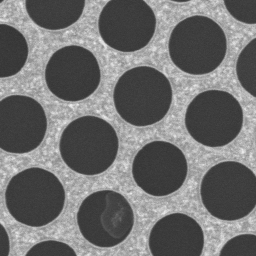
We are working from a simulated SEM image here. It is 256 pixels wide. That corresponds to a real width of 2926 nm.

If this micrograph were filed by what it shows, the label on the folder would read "a regular array of holes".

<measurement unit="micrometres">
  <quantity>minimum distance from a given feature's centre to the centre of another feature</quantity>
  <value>0.841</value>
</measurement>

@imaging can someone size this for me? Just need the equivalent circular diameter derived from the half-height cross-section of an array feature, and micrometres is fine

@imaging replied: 0.67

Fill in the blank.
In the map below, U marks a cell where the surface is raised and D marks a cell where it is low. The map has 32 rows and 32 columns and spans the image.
UUUDDDDDDDDUUDDDDDUUUUUUUUUUDDDD
UUUDDDDDDDUUUDDDDDDUUUUUUUUUUDDD
UUUUDDDDDDUUDDDDDDDUUUUDDDDUUUDD
DDUUUDDDUUUUDDDDDDDUUUDDDDDDUUUU
DDDUUUUUUUUUUDDDDDDUUDDDDDDDUUUU
DDDUUUUUUUUUUDDDDDUUUDDDDDDDUUUD
DDDDUUUDDDDUUUUDDUUUUDDDDDDDUUDD
DDDUUUDDDDDDUUUUUUUUUDDDDDDDUUDD
DDDUUUDDDDDDUUUUUDDUUUDDDDDUUDDD
DUUUUUDDDDDDDUUDDDDDDUUUUUUUUUDD
UUUUUUDDDDDDUUUDDDDDDUUUUUUUUUDD
UUUUUUDDDDDDUUDDDDDDDDUUUDDDUUUD
DDDDUUUUDDUUUUDDDDDDDUUUDDDDDDUU
DDDDDUUUUUUUUUDDDDDDDUUDDDDDDDUU
DDDDDDUUUUUDUUUDDDDDDUUDDDDDDDUU
DDDDDDUUUDDDDDUUDDDUUUUDDDDDDDUU
DDDDDDUUDDDDDDUUUUUUUUUDDDDDDDUU
DDDDDUUDDDDDDDDUUUUUUUUUDDDDDUUU
DDDDUUUDDDDDDDDUUUDDDDUUUUUUUUUU
UUUUUUUUDDDDDDDUUDDDDDDUUUUUUUUU
UUUUUUUUDDDDDDUUUDDDDDDUUUUDDDUU
UUUDDDUUUUDDDUUUDDDDDDDUUUDDDDDD
UDDDDDDUUUUUUUUUUDDDDDDUUDDDDDDD
UDDDDDDDUUUUUUUUUUDDDDUUUDDDDDDD
UDDDDDDDUUUDDDDUUUUDUUUUUDDDDDDD
UDDDDDDDUUDDDDDDUUUUUUUUUDDDDDDD
UDDDDDDDUUDDDDDDDUUUUUUUUUDDDDDU
UUDDDDDUUUDDDDDDDUUUDDDDUUUUDDUU
DUUUUUUUUUDDDDDDUUUDDDDDDUUUUUUU
DUUUUUUUUUDDDDDDUUUDDDDDDUUUUDDD
DUUUUDDDUUUUDDDUUUUDDDDDDUUUDDDD
DUUDDDDDDUUUUUUUUUUDDDDDDUUUDDDD